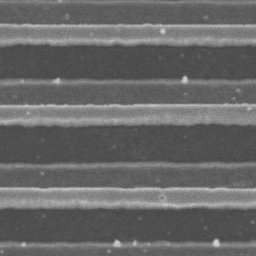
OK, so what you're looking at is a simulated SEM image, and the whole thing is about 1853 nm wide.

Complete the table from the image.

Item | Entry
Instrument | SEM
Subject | lines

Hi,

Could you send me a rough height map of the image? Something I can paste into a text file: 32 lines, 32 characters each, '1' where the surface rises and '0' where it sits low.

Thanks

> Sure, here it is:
11111111111111111111111111111111
11111111111111111111111111111111
11111111111111111111111111111111
11111111111111111111111111111111
11111111111111111111111111111111
11000011000001011000011100110000
00000000000000000000000000000000
00000000000000000000000000000000
00000000000000000000000000000000
00000000000000000000000000000000
11111111111111111111111111111111
11111111111111111111111111111111
11111111111111111111111111111111
11111111111111111111111111111111
11111111111111111111111111111111
11111111111110100000001100000010
00000000000000000000000000000000
00000000000000000000000000000000
00000000000000000000000000000000
00000000000000000000000000000000
00000000000000000000000000000000
11111111111111111111111111111111
11111111111111111111111111111111
11111111111111111111111111111111
11111111111111111111111111111111
11111111111111111111111111111111
00000000000000000000000000000000
00000000000000000000000000000000
00000000000000000000000000000000
00000000000000000000000000000000
00000000000000101000100000110000
11111111111111111111111111111111